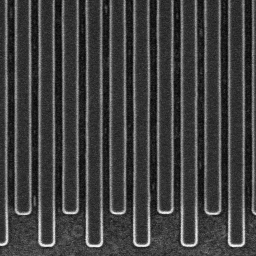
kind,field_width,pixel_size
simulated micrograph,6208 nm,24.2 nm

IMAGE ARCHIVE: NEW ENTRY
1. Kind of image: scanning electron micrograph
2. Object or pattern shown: parallel lines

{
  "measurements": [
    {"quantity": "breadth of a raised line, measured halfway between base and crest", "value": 0.373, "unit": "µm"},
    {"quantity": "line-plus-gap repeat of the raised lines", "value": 575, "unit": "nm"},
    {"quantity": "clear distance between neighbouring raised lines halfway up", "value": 0.209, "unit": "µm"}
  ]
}